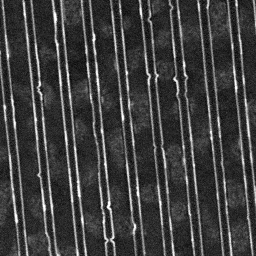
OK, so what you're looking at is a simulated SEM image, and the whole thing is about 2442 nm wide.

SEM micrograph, parallel lines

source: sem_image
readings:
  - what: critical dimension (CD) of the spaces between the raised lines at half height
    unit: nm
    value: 189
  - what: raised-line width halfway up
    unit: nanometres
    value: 86.6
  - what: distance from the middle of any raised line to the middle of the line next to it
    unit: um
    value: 0.277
